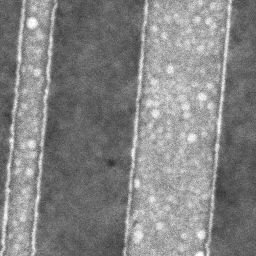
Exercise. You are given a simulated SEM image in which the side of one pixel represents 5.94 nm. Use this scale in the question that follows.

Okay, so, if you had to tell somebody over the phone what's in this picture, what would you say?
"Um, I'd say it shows one or a few lines or trenches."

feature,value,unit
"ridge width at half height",551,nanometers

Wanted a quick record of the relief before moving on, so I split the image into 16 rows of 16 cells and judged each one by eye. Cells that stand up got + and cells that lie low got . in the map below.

+..++++++.....++
+..++++++.....++
+..++++++.....++
+..++++++.....++
+..++++++.....++
+..++++++.....++
+..++++++.....++
+..++++++.....++
+..+++++......++
+..+++++......++
+.++++++.....+++
+.++++++.....+++
..++++++.....+++
..++++++.....+++
..++++++.....+++
..++++++.....+++